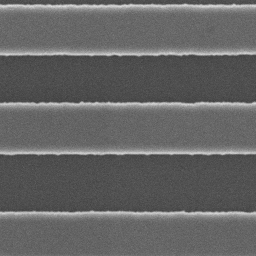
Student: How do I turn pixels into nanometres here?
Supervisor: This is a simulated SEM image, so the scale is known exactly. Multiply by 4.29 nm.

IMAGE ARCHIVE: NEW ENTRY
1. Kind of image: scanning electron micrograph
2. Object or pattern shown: lines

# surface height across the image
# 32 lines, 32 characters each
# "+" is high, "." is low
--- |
................................
++++++++++++++++++++++++++++++++
++++++++++++++++++++++++++++++++
++++++++++++++++++++++++++++++++
++++++++++++++++++++++++++++++++
++++++++++++++++++++++++++++++++
++++++++++++++++++++++++++++++++
................................
................................
................................
................................
................................
................................
++++++++++++++++++++++++++++++++
++++++++++++++++++++++++++++++++
++++++++++++++++++++++++++++++++
++++++++++++++++++++++++++++++++
++++++++++++++++++++++++++++++++
++++++++++++++++++++++++++++++++
................................
................................
................................
................................
................................
................................
................................
................................
++++++++++++++++++++++++++++++++
++++++++++++++++++++++++++++++++
++++++++++++++++++++++++++++++++
++++++++++++++++++++++++++++++++
++++++++++++++++++++++++++++++++